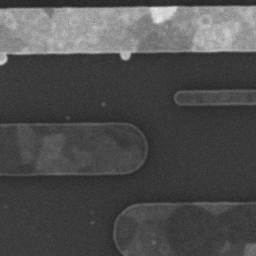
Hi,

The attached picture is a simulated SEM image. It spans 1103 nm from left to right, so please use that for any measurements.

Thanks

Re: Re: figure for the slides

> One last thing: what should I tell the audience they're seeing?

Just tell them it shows groups of lines, slits or small figures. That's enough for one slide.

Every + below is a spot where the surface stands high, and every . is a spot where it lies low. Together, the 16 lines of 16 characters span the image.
........++++++++
++++++++++++++++
++++++++++++++++
+...............
................
................
...........++...
................
+++++++++.......
+++++++++.......
+++++++++.......
................
................
.......+++++++++
.......+++++++++
.......+++++++++